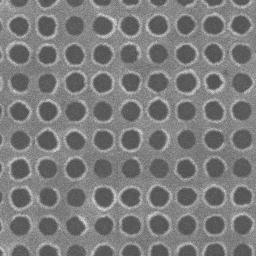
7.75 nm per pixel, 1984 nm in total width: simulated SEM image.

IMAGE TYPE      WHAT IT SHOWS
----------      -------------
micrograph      a regular array of holes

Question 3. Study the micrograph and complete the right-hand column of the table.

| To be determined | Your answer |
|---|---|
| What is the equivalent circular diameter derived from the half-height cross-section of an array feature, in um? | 0.15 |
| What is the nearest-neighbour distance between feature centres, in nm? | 212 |